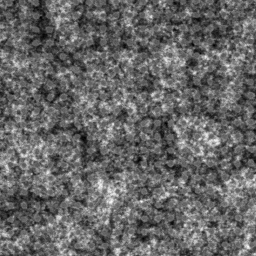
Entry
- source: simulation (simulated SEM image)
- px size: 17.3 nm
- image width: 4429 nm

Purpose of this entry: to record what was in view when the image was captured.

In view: a regular array of raised bodies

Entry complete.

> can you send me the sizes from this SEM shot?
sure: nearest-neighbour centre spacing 226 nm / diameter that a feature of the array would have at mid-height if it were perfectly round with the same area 0.105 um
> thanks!